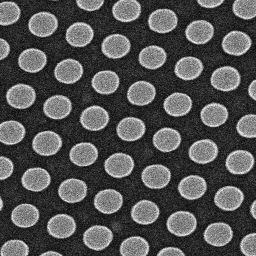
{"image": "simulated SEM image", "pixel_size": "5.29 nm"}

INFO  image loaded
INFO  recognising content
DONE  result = a regular array of raised bodies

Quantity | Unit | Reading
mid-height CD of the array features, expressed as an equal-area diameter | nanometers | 134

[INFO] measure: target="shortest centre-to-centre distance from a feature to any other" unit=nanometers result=198